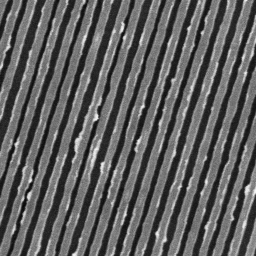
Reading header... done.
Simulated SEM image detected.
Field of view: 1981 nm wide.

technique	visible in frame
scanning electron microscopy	parallel lines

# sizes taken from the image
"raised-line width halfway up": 62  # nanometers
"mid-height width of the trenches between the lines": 53.7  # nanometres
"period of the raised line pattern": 114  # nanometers